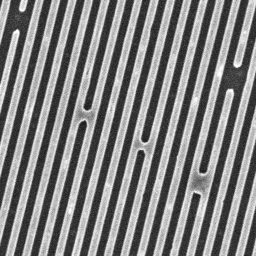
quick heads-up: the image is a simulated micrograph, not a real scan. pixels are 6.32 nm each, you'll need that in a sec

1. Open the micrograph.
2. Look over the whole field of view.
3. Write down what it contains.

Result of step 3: parallel lines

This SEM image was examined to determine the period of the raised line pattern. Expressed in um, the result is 0.101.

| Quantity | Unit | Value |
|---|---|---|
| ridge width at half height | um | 0.0437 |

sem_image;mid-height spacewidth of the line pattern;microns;0.0545